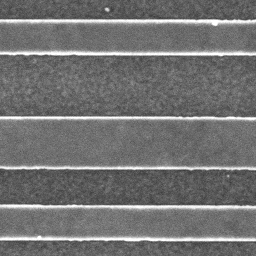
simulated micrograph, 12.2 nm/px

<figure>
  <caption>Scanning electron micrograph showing lines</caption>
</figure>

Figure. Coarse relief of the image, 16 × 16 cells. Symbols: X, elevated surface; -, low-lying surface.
----------------
XXXXXXXXXXXXXXXX
XXXXXXXXXXXXXXXX
----------------
----------------
----------------
----------------
XXXXXXXXXXXXXXXX
XXXXXXXXXXXXXXXX
XXXXXXXXXXXXXXXX
XXXXXXXXXXXXXXXX
----------------
----------------
XXXXXXXXXXXXXXXX
XXXXXXXXXXXXXXXX
----------------